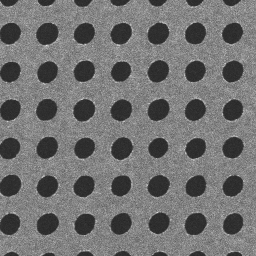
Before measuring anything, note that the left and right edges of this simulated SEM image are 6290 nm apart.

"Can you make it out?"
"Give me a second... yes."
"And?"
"a regular array of holes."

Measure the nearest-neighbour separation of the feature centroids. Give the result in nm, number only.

908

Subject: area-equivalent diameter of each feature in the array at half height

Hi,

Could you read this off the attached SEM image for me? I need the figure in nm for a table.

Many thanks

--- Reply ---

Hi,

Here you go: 525